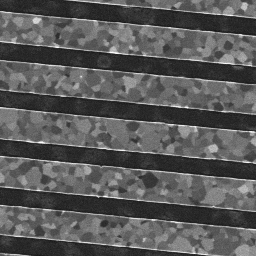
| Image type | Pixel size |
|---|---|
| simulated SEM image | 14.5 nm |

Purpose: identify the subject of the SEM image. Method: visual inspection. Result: parallel lines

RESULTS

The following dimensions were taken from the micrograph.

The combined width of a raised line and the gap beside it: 48.1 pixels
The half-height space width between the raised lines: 18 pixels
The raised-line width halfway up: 438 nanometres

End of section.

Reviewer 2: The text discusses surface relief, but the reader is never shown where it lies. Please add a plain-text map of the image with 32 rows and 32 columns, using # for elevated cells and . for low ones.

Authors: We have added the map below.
..............##################
#........................#######
###########.....................
#####################...........
################################
...#############################
.............###################
........................########
##########......................
####################............
##############################..
...#############################
.............###################
#.......................########
##########......................
#####################...........
################################
.###############################
............####################
.......................#########
##########......................
#####################...........
###############################.
..##############################
............####################
......................##########
#########.......................
###################.............
##############################..
..##############################
.............###################
.......................#########